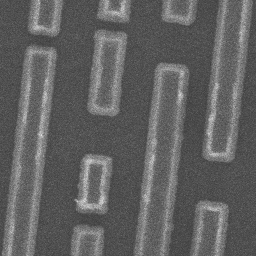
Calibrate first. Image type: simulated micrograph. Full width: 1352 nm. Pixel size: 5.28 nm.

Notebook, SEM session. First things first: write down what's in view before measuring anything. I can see one or a few lines or trenches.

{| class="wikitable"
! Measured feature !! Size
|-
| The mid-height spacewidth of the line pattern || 0.206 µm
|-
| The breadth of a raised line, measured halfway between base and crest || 132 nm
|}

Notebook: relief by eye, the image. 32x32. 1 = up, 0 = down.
00001110000001110000011100001110
00001110000001110000011100001110
00001110000000000000001100001110
00001110000000000000000000001110
00000000000000000000000000011110
00000000000011100000000000011110
00001100000011100000000000011100
00011110000011100000000000011100
00011100000011100000110000011100
00011100000011100000111000011100
00011100000011100000111000011100
00011100000011100000111000011100
00011100000111100001111000111100
00011100000011000001111000111100
00011100000000000001111000111000
00011100000000000001110000111000
00111000000000000001110000111000
00111000000000000001110000111000
00111000000000000001110000111000
00111000000000000001110000111000
00111000000111000001110000000000
00111000001111000011110000000000
00111000001110000011110000000000
00111000001110000011110000000000
00111000001110000011100000000000
01111000001110000011100001000000
01110000000000000011100001110000
01110000000000000011100001110000
01110000000000000011100001110000
01110000001110000011100011110000
01110000011100000111100011110000
01110000011100000111100011110000